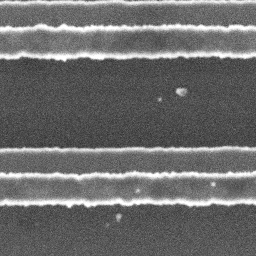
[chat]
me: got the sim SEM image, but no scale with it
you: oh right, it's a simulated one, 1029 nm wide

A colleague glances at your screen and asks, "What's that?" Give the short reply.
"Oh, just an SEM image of lines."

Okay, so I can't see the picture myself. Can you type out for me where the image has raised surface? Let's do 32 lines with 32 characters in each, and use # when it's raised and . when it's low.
################################
################################
################################
################################
################################
################################
################################
................................
................................
................................
................................
................................
................................
................................
................................
................................
................................
................................
...............###.#.#...#.####.
################################
################################
################################
################################
################################
################################
##############.##..###.###..#..#
................................
................................
................................
................................
................................
................................